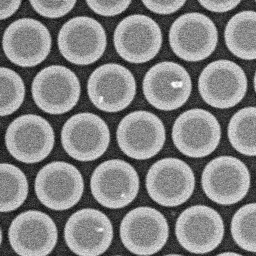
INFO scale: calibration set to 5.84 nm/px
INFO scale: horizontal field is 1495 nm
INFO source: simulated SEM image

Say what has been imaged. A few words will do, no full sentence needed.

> an array of small figures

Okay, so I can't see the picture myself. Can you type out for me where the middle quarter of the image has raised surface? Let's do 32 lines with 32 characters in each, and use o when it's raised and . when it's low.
.........ooooo........ooooooo...
o.......oooooooo.....ooooooooo..
oo.....oooooooooo....oooooooooo.
ooo...ooooooooooo...ooooooooooo.
oooo..oooooooooooo..oooooooooooo
oooo..oooooooooooo..oooooooooooo
oooo..oooooooooooo..oooooooooooo
oooo..oooooooooooo..ooooooooooo.
oooo..ooooooooooo....oooooooooo.
ooo....oooooooooo....ooooooooo..
oo......oooooooo......ooooooo...
o.........oooo.................o
....ooo.........oooooo.......ooo
..ooooooo......oooooooo.....oooo
.ooooooooo....oooooooooo....oooo
ooooooooooo...ooooooooooo..ooooo
ooooooooooo..oooooooooooo..ooooo
ooooooooooo..oooooooooooo..ooooo
ooooooooooo..oooooooooooo..ooooo
ooooooooooo..oooooooooooo..ooooo
ooooooooooo...ooooooooooo...oooo
oooooooooo....oooooooooo.....ooo
.ooooooooo.....oooooooo.......oo
..oooooo.........oooo...........
..........ooooo........ooooooo..
oo.......oooooooo.....ooooooooo.
ooo.....oooooooooo...ooooooooooo
oooo...ooooooooooo...ooooooooooo
oooo...ooooooooooo...ooooooooooo
ooooo..oooooooooooo..ooooooooooo
ooooo..oooooooooooo..ooooooooooo
ooooo..ooooooooooo...ooooooooooo